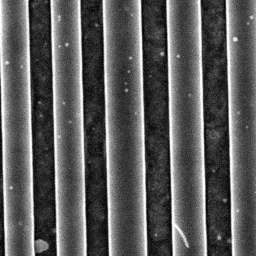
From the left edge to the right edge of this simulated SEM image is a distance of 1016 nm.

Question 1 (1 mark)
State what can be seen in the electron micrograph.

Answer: groups of lines, slits or small figures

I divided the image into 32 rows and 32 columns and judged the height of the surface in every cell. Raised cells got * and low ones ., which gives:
***...****...****....****...****
***...****...*****...****...****
***....***...*****...****...****
***....***...*****...****...****
****...***...*****...****....***
****...***...*****...****....***
****...***...*****...****....***
****...***...*****...****....***
****...***...*****...****....***
****...***...*****...****....***
****...***...*****...****....***
****...***...*****...****....***
****...***...*****...****....***
****...***...*****...****....***
****...***...*****...****....***
****...***...*****...****....***
****...***...*****...****....***
****...***...*****...****....***
****...***...*****...****....***
****...***...*****...****....***
****...***...*****...****....***
.***...***...*****...****....***
.***...***...*****....****...***
.***...***....****....****...***
.***...****...****....****...***
.***...****...****....****...***
.***...****...****....****...***
.***...****...****....****...***
.***...****...****....****...***
.***...****...****....****...***
.***...****...****....****...***
.***...****...****....****...***